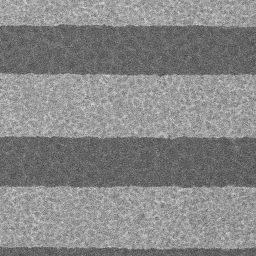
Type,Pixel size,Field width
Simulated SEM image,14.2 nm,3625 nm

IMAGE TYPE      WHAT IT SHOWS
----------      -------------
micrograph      one or a few lines or trenches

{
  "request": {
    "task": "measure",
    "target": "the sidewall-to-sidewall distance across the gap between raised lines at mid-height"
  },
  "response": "704 nm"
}